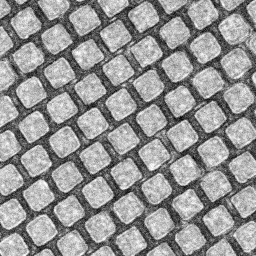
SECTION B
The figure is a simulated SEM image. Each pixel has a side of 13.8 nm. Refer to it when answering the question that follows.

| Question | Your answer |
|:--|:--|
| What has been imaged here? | a regular array of raised bodies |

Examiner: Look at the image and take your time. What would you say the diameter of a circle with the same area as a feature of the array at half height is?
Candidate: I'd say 374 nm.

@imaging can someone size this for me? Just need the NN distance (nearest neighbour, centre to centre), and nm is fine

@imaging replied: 468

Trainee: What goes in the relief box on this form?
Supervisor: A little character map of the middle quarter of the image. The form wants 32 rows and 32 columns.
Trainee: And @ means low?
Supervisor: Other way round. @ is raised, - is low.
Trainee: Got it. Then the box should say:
@---@@@---@@@@@@@---@----@@@@@@@
@@--------@@@@@@@--------@@@@@@@
@@@--------@@@@@@---@@@---@@@@@-
@@---@@@---@@@@@---@@@@@---@@@--
@---@@@@@---@@@---@@@@@@--------
---@@@@@@@--------@@@@@@@-------
---@@@@@@@----@---@@@@@@@---@@@-
@---@@@@@@---@@@---@@@@@--@@@@@-
@---@@@@@--@@@@@@---@@---@@@@@@@
@@---@@----@@@@@@--------@@@@@@@
@@@--------@@@@@@@----@---@@@@@@
@@@----@@--@@@@@@---@@@@---@@@@-
@@@--@@@@---@@@@---@@@@@@--@@@--
@---@@@@@@---@@---@@@@@@@-------
----@@@@@@@--------@@@@@@@---@@-
----@@@@@@@---@@---@@@@@@---@@@@
@@---@@@@@---@@@@---@@@@---@@@@@
@@@--@@@@--@@@@@@@---@----@@@@@@
@@@---@----@@@@@@@--------@@@@@@
@@@@--------@@@@@@----@@---@@@@@
@@@@---@@---@@@@@@--@@@@@---@@@-
@@@--@@@@@---@@@---@@@@@@---@@--
@---@@@@@@@---@----@@@@@@@------
----@@@@@@@--------@@@@@@@----@@
-----@@@@@@----@@---@@@@@---@@@@
@@@--@@@@@---@@@@@---@@@---@@@@@
@@@---@@@---@@@@@@@--------@@@@@
@@@@--------@@@@@@@--------@@@@@
@@@@----@----@@@@@@---@@@---@@@@
@@@@---@@@---@@@@----@@@@@---@@-
@@---@@@@@@---@@---@@@@@@@------
@----@@@@@@@--------@@@@@@@----@